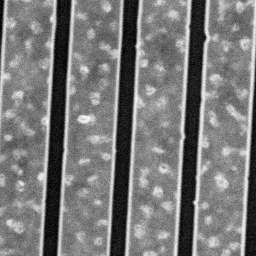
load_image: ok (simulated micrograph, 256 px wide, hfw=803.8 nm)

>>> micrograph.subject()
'one or a few lines or trenches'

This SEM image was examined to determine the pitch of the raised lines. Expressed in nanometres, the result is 211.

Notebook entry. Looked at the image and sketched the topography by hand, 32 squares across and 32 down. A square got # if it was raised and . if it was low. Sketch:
.######..######...######..######
.######..######..#######..######
.######..######..#######..######
#######..######..#######..######
#######..######..######...######
#######..######..######...######
#######..######..######...######
#######..######..######...######
######...######..######..#######
######...######..######..#######
######..#######..######..#######
######..#######..######..######.
######..#######..######..######.
######..#######..######..######.
######..#######..######..######.
######..######...######..######.
######..######...######..######.
######..######...######..######.
######..######...######..######.
######..######..#######..######.
######..######..#######..######.
######..######..#######..######.
######..######..######...######.
######..######..######...######.
######..######..######...######.
######..######..######..#######.
######..######..######..#######.
#####...######..######..#######.
#####..#######..######..#######.
#####..#######..######..######..
#####..#######..######..######..
#####..#######..######..######..